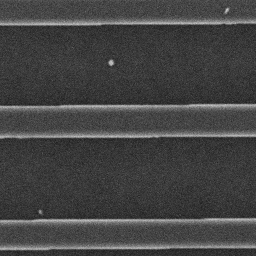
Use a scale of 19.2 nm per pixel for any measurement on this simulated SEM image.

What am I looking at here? lines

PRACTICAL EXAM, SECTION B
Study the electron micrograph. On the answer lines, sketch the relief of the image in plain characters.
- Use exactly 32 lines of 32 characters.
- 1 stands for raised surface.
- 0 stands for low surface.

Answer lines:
11111111111111111111111111111111
11111111111111111111111111111111
11111111111111111111111111111111
00000000000000000000000000000000
00000000000000000000000000000000
00000000000000000000000000000000
00000000000000000000000000000000
00000000000000000000000000000000
00000000000000000000000000000000
00000000000000000000000000000000
00000000000000000000000000000000
00000000000000000000000000000000
00000000000000000000000000000000
11111111111111111111111111111111
11111111111111111111111111111111
11111111111111111111111111111111
11111111111111111111111111111111
00000000000000000000000000000000
00000000000000000000000000000000
00000000000000000000000000000000
00000000000000000000000000000000
00000000000000000000000000000000
00000000000000000000000000000000
00000000000000000000000000000000
00000000000000000000000000000000
00000000000000000000000000000000
00000000000000000000000000000000
00000011111111111111111111111111
11111111111111111111111111111111
11111111111111111111111111111111
11111111111111111111111111111111
00000000000000000000000000000000